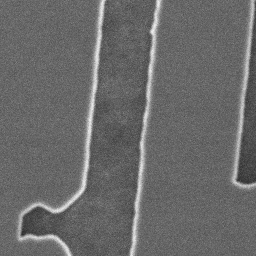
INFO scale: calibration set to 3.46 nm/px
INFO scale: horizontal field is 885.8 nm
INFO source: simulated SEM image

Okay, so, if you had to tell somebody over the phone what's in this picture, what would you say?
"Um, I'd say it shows one or a few lines or trenches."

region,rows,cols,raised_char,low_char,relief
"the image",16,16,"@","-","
@@@@@@----@@@@@@
@@@@@@----@@@@@@
@@@@@@----@@@@@@
@@@@@@---@@@@@@@
@@@@@@---@@@@@@-
@@@@@@---@@@@@@-
@@@@@@---@@@@@@-
@@@@@@---@@@@@@-
@@@@@@---@@@@@@-
@@@@@@---@@@@@@-
@@@@@----@@@@@@-
@@@@@----@@@@@@-
@@@@@----@@@@@@@
@@------@@@@@@@@
@-------@@@@@@@@
@@@@----@@@@@@@@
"